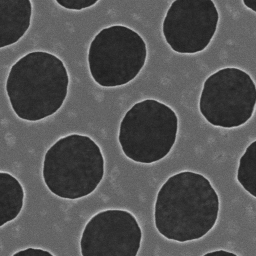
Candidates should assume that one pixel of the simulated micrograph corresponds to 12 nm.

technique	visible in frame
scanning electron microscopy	holes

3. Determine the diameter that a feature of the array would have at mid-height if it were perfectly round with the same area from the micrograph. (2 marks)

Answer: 748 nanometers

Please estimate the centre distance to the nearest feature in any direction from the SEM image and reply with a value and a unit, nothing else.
0.99 micrometres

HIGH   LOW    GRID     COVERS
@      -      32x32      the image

----@@@-----@@@@@@@@@------@@@@-
----@@@@@@@@@@@@@@@@@------@@@@@
----@@@@@@@@@@@@@@@@@------@@@@@
----@@@@@@@@@---@@@@-------@@@@@
---@@@@@@@@@-----@@@@------@@@@@
-@@@@@@@@@@-------@@@-----@@@@@@
@@@@-@@@@@@-------@@@@---@@@@@@@
@@-----@@@@-------@@@@@@@@@@@@@@
@-------@@@-------@@@@@@@@@@@@@@
@-------@@@@-----@@@@@@@@@-----@
@-------@@@@---@@@@@@@@@@@------
@-------@@@@@@@@@@@@@@@@@-------
@-------@@@@@@@@@@-@@@@@@-------
@@-----@@@@@@@@@-----@@@@-------
@@----@@@@@@@@@@------@@@------@
@@@@@@@@@@@@@@@-------@@@@----@@
@@@@@@@@@@@@@@@-------@@@@@@@@@@
@@@@@@@----@@@@-------@@@@@@@@@@
@@@@@@------@@@------@@@@@@@@@@-
@@@@@@-------@@@-----@@@@@@@@@--
@@@@@--------@@@@@@@@@@@@@@@@@--
@@@@@--------@@@@@@@@@@-@@@@@@--
--@@@@-------@@@@@@@@-----@@@@--
---@@@------@@@@@@@@-------@@@@-
---@@@@----@@@@@@@@@-------@@@@@
---@@@@@@@@@@@@@@@@--------@@@@@
--@@@@@@@@@@@---@@@--------@@@@@
-@@@@@@@@@@------@@--------@@@@@
@@@@@@@@@@@-------@@------@@@@@@
@@@@@@@@@@--------@@@----@@@@@@@
@@@@@@@@@@--------@@@@@@@@@@@@@@
@@----@@@@-------@@@@@@@@@@--@@@